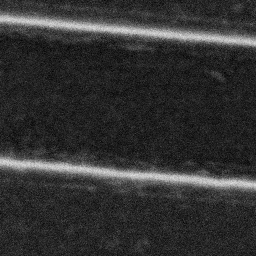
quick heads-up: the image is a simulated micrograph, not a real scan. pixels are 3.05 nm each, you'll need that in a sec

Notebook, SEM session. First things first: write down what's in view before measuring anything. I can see one or a few lines or trenches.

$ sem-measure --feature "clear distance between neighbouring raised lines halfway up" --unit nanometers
432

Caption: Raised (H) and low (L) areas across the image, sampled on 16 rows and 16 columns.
HHHHHHHHHHHHHHHH
LLLHHHHHHHHHHHHH
LLLLLLLLLLLLLLHH
LLLLLLLLLLLLLLLL
LLLLLLLLLLLLLLLL
LLLLLLLLLLLLLLLL
LLLLLLLLLLLLLLLL
LLLLLLLLLLLLLLLL
LLLLLLLLLLLLLLLL
LLLLLLLLLLLLLLLL
HHHHLLLLLLLLLLLL
HHHHHHHHHHHHHHHH
HHHHHHHHHHHHHHHH
HHHHHHHHHHHHHHHH
HHHHHHHHHHHHHHHH
HHHHHHHHHHHHHHHH